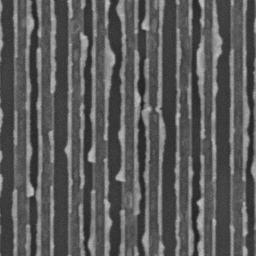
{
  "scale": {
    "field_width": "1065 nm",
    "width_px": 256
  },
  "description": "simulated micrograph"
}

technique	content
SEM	parallel lines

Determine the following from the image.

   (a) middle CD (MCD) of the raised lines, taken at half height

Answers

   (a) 68.8 nm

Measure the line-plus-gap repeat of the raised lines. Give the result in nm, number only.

112